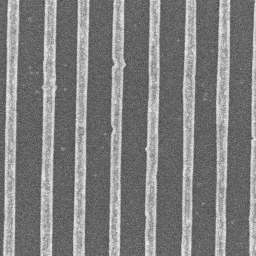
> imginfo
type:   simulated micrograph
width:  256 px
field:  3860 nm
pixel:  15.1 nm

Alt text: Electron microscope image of parallel lines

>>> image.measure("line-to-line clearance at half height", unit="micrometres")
0.401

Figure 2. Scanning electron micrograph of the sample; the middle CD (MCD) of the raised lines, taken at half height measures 8.87 px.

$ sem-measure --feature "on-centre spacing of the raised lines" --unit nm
531